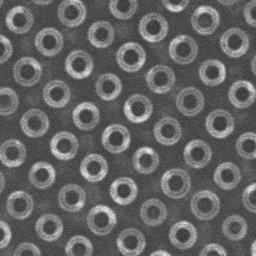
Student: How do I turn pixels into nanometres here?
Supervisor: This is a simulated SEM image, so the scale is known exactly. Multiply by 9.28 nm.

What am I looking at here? a regular array of ring-shaped raised bodies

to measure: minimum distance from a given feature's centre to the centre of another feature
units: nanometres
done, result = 341